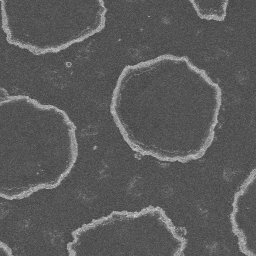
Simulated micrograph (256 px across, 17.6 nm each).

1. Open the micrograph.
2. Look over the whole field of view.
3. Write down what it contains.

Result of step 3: raised bodies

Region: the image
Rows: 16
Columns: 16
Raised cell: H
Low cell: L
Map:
HHHHHHLLLLLLHHLL
HHHHHHLLLLLLLLLL
LHHHHLLLLLLLLLLL
LLLLLLLLLLLLLLLL
LLLLLLLLHHHHLLLL
LLLLLLLHHHHHHLLL
HHLLLLLHHHHHHHLL
HHHHLLLHHHHHHLLL
HHHHHLLLHHHHHLLL
HHHHHLLLLHHHHLLL
HHHHLLLLLLLLLLLL
HHHLLLLLLLLLLLLH
LLLLLLLLLLLLLLLH
LLLLLLLHHHLLLLLH
LLLLLHHHHHHLLLLH
LLLLHHHHHHHLLLLH